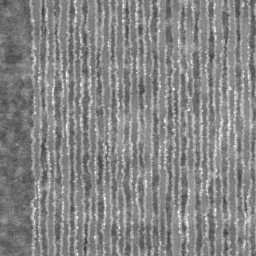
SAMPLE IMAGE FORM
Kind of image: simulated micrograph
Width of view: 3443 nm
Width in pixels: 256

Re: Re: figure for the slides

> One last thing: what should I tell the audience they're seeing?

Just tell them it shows parallel lines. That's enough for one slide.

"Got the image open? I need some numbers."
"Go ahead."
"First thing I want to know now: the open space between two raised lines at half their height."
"6 pixels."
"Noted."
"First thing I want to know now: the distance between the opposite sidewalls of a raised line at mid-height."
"8.37 px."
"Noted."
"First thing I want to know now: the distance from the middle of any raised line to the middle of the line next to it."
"188 nanometers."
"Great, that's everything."